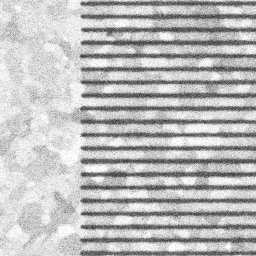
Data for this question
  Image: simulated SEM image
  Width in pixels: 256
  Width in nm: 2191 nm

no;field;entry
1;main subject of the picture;parallel lines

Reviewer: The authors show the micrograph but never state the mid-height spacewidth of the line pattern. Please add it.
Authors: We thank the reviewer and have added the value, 44.9 nm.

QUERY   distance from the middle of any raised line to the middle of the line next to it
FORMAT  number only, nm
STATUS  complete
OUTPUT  113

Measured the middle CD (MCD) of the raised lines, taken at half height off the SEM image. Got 7.87 px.